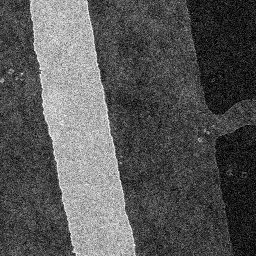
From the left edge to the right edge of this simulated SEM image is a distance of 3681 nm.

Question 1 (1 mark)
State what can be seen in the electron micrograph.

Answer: one or a few lines or trenches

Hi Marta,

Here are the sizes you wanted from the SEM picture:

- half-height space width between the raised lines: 1.4 µm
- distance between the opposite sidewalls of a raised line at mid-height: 846 nm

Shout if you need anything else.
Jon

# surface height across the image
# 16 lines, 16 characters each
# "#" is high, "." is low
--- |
..###.......####
..####......####
..####......####
..####......####
...###......####
...###.......###
...####......##.
...####.........
...####.......##
...####......###
....###.......##
....####......##
....####......##
....####......##
....####......##
.....###......##